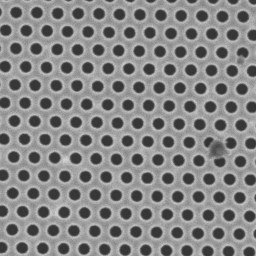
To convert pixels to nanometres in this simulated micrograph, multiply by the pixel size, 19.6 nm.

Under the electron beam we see a regular array of holes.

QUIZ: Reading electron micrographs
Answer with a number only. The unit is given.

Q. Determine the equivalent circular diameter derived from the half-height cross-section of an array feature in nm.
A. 234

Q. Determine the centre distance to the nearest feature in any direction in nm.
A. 398